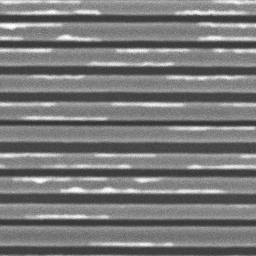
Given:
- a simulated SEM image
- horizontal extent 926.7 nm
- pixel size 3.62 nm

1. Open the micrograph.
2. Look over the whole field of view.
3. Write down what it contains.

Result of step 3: parallel lines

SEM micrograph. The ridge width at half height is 60.7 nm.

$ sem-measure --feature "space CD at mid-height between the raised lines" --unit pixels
8.87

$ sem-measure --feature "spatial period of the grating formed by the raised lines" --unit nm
92.6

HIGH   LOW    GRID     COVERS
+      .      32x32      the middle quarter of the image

................................
................................
................................
++++++++++++++++++++++++++++++++
++++++++++++++++++++++++++++++++
++++++++++++++++++++++++++++++++
++++++++++++++++++++++++++++++++
................................
................................
................................
++++++++++++++++++++++++++++++++
++++++++++++++++++++++++++++++++
++++++++++++++++++++++++++++++++
++++++++++++++++++++++++++++++++
................................
................................
++++++++++++++++++++++++++++++++
++++++++++++++++++++++++++++++++
++++++++++++++++++++++++++++++++
............++++................
................................
................................
+++++++++++.......++++++++++++..
++++++++++++++++++++++++++++++++
++++++++++++++++++++++++++++++++
++++++++++++++++++++++++++++++++
................................
................................
+++++++++++....+++++++++++++...+
++++++++++++++++++++++++++++++++
++++++++++++++++++++++++++++++++
++++++++++++++++++++++++++++++++